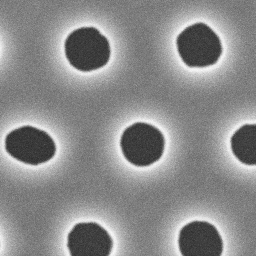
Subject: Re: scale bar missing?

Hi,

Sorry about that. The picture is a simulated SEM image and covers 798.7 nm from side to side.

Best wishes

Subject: holes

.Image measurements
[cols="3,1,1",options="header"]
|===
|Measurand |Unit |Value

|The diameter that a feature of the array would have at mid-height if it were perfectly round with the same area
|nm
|140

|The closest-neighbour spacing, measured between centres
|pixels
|111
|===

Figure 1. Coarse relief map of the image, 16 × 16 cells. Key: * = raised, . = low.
****************
************.***
****...****...**
****...****...**
****************
****************
****************
****************
...*****..*****.
...*****..*****.
****************
****************
****************
****************
****...****...**
****...****...**